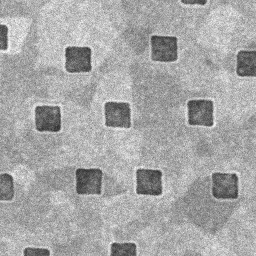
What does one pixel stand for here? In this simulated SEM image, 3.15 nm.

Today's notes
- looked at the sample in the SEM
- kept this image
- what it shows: a regular array of holes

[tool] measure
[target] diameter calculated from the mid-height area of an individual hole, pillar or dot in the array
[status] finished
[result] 0.0958 um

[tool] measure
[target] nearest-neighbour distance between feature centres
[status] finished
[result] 211 nanometers